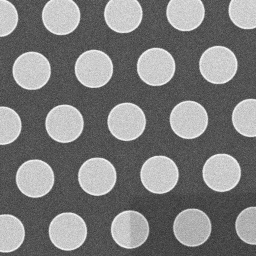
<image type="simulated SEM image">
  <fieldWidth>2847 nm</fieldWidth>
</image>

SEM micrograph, an array of small figures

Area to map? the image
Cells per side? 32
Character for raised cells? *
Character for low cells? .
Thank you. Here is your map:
*.....***....****....****....***
**...*****...*****...*****...***
**...*****...*****...****....***
**....***.....***.....**......**
................................
................................
...........**.....***.....***...
..****....****...*****...*****..
..****...*****...*****...*****..
..****....****...*****...****...
..****....***......*............
................................
...............................*
*......**.....***.....***....***
**....****....****...*****...***
***...****...*****...*****...***
**....****....****....***.....**
**.....**......*................
................................
...........................**...
...***....****....****....****..
..*****...****....****...*****..
..*****...****....****....****..
..****....****....****....***...
....*...........................
................................
................*......**.....**
**.....***....****....****....**
***...*****...*****...****...***
***...*****...****....****....**
***....***.....***.....**......*
................................